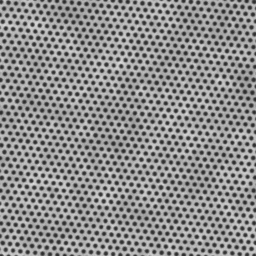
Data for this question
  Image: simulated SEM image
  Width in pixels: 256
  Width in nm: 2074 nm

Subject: a regular array of holes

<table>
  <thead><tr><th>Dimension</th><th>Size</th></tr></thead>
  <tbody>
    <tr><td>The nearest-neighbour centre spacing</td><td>58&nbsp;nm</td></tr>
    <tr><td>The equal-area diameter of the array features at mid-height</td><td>4.37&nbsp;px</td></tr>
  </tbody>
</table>